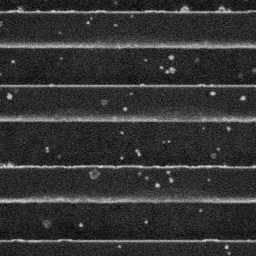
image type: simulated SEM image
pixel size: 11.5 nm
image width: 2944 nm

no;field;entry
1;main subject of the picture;lines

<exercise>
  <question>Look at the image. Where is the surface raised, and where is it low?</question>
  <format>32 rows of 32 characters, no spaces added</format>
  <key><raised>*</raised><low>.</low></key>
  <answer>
................................
.**.*.****..**....****........**
********************************
********************************
********************************
********************************
................................
................................
................................
................................
................................
********************************
********************************
********************************
********************************
................................
................................
................................
................................
................................
................................
********************************
********************************
********************************
********************************
................................
................................
................................
................................
................................
********************************
********************************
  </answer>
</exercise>